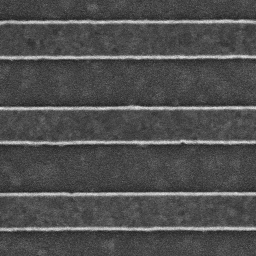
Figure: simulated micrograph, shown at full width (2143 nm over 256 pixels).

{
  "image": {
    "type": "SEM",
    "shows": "one or a few lines or trenches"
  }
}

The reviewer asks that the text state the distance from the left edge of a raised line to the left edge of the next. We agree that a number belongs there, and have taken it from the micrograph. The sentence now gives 719 nm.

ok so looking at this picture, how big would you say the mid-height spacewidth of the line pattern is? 0.431 µm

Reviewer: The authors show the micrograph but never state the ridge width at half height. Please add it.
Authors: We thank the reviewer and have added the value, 291 nm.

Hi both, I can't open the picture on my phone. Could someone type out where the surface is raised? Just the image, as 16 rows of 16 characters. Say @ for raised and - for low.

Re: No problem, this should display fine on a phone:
----------------
@@@@@@@@@@@@@@@@
@@@@@@@@@@@@@@@@
@@@@@@@@@@@@@@@@
----------------
----------------
----------------
@@@@@@@@@@@@@@@@
@@@@@@@@@@@@@@@@
----------------
----------------
----------------
@@@@@@@@@@@@@@@@
@@@@@@@@@@@@@@@@
----------------
----------------